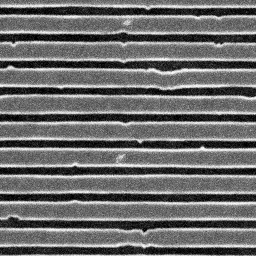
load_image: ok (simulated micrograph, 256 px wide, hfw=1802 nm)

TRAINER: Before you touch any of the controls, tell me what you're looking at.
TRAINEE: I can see parallel lines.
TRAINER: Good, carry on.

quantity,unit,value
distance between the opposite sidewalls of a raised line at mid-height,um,0.119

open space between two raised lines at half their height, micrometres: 0.066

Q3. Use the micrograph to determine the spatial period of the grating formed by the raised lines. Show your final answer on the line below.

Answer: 187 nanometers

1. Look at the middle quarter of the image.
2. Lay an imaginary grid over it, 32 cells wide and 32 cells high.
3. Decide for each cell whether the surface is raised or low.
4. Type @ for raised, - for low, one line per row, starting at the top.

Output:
--------------------------------
@@@@@@@@@@@@@@------------------
@@@@@@@@@@@@@@@@@@@@@@@@@@@@@@@@
@@@@@@@@@@@@@@@@@@@@@@@@@@@@@@@@
@@@@@@@@@@@@@@@@@@@@@@@@@@@@@@@@
@@@@@@@@@@@@@@@@@@@@@@@@@@@@@@@@
--------------------------------
--------------------------------
@@@@@@@@@@@@@@@@@@@@@@@@@@@@@@@@
@@@@@@@@@@@@@@@@@@@@@@@@@@@@@@@@
@@@@@@@@@@@@@@@@@@@@@@@@@@@@@@@@
@@@@@@@@@@@@@@@@@@@@@@@@@@@@@@@@
--------------------------------
--------------------------------
--------------------------------
@@@@@@@@@@@@@@@@@@@@@@@@@@@@@@@@
@@@@@@@@@@@@@@@@@@@@@@@@@@@@@@@@
@@@@@@@@@@@@@@@@@@@@@@@@@@@@@@@@
@@@@@@@@@@@@@@@@@@@@@@@@@@@@@@@@
--------------------------------
--------------------------------
@@@@@@@@@@@--@@@----------------
@@@@@@@@@@@@@@@@@@@@@@@@@@@@@@@@
@@@@@@@@@@@@@@@@@@@@@@@@@@@@@@@@
@@@@@@@@@@@@@@@@@@@@@@@@@@@@@@@@
----------------------@@----@@@@
--------------------------------
--------------------------------
@@@@@@@@@@@@@@@@@@@@@@@@@@@@@@@@
@@@@@@@@@@@@@@@@@@@@@@@@@@@@@@@@
@@@@@@@@@@@@@@@@@@@@@@@@@@@@@@@@
@@@@@@@@@@@@@@@@@@@@@@@@@@@@@@@@